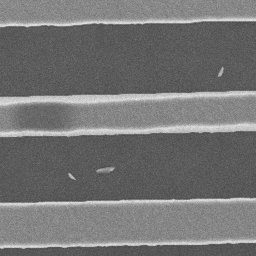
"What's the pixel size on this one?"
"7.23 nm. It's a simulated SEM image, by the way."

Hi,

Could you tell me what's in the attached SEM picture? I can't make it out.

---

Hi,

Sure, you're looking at lines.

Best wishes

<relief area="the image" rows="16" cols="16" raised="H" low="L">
HHHHHHHHHHHHHHHH
HHHHHLLLLLLLLLLL
LLLLLLLLLLLLLLLL
LLLLLLLLLLLLLLLL
LLLLLLLLLLLLLLLL
LLLLLLLLLLLLLLLL
HHHHHHHHHHHHHHHH
HHHHHHHHHHHHHHHH
LLLLLLLLLLLLLLLL
LLLLLLLLLLLLLLLL
LLLLLLLLLLLLLLLL
LLLLLLLLLLLLLLLL
LLLLLLLLLLLLHHHH
HHHHHHHHHHHHHHHH
HHHHHHHHHHHHHHHH
HLLLLLLLLLLLLLLL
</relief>